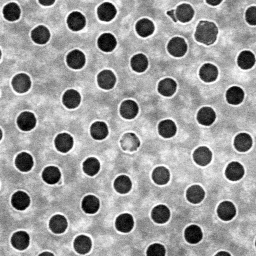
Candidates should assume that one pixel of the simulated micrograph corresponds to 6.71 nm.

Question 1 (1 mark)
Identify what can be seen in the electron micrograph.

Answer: a regular array of holes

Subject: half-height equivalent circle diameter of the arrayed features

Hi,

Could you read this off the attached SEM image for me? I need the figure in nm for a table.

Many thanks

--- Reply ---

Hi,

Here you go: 137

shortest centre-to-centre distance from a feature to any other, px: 35.4